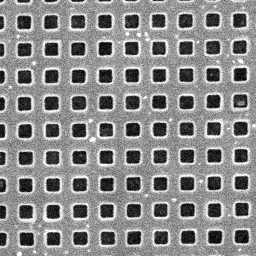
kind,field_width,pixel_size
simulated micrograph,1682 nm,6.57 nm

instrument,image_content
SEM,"a regular array of holes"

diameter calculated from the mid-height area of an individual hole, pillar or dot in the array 103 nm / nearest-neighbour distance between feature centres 175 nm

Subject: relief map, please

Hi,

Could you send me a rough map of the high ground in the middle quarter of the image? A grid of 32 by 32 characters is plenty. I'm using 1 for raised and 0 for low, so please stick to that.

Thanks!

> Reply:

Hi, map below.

11111111111111111111111111111111
11100111100011100001110000111000
11000011000011100001110000111000
11000011000011100001110000111000
11000111100011100001110001111000
11111111111111111111111111111111
11111111111111111111111111111111
11111111111111111111111111111111
11000111100011100001110001111000
11000011100001100001110000111000
11000011100001100001110000111000
11000111100111110011111001111111
11111111111111111111111111111111
11111111111111111111111111111111
11111111111111111111111001111000
11000011100011100001110000111000
11000011100011100001110000111000
11000011000011100001110000111000
11100111100111111111111111111111
11111111111111111111111111111111
11111111111111111111111111111111
11111111100011110001111001111000
11000011100001100001110000111000
11000011100011100001110000111000
11000011100011100001110000111000
11111111111111111111111111111111
11111111111111111111111111111111
11111111111111111111111111111111
11100111110011110001110000111000
11000011100001100001110000111000
11000011100001100001110000111000
11000011100011110001111000111000